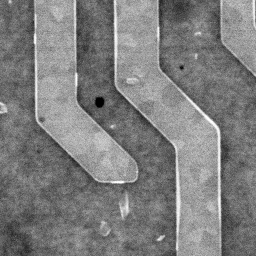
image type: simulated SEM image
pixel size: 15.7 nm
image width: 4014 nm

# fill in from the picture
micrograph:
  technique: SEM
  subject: groups of lines, slits or small figures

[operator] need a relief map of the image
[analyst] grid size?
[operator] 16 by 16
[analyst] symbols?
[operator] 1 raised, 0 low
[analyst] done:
0011100111000011
0011100111000011
0011100111000011
0011100111000001
0011100111000000
0011100111100000
0011100011110000
0011110001111000
0001111000111100
0000111100011100
0000011110011100
0000000000011100
0000000000011100
0000000000011100
0000000000011100
0000000000011100